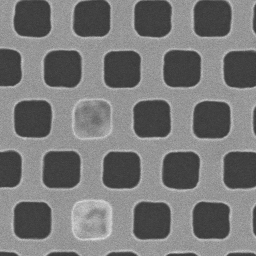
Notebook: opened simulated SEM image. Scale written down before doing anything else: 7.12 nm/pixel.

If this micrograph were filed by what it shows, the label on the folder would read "a regular array of holes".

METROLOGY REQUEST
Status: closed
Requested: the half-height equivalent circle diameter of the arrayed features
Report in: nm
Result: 287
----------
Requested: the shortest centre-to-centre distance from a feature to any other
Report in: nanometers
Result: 416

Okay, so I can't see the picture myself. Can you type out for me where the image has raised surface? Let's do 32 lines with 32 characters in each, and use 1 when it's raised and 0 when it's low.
11000011110000111000011110000111
11000011100000111000011100000111
11000011100000111000011100000111
11000011100000111000011100000111
11100011110001111100111110001111
11111111111111111111111111111111
00111100001111000111100011111000
00011100001110000011100001110000
00011000001110000011000001110000
00011000001110000011000001110000
00111100001110000111100001110000
11111111111111111111111111111111
11111111111111111111111111111111
11000011111111111000011100000111
11000011111111111000011100000111
11000011111111111000011100000111
11000011111111111000011100000111
11111111111111111111111111111111
11111111111111111111111111111111
00111100001110000111100001110000
00011100001110000011000001110000
00011000001110000011000001110000
00111000001110000111000001110000
11111100011111000111100011111001
11111111111111111111111111111111
11000011111111111000011110001111
11000011111111111000011100000111
11000011111111111000011100000111
11000011111111111000011100000111
11000011111111111000011100001111
11111111111111111111111111111111
01111110011111111111111111111111